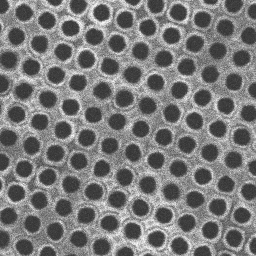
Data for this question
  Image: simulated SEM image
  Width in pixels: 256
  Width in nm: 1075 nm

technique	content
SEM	a regular array of holes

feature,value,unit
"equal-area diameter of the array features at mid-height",0.0678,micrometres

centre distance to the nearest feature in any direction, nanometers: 102